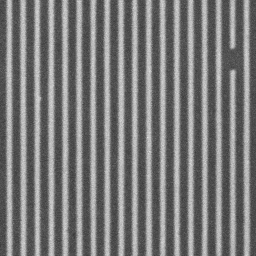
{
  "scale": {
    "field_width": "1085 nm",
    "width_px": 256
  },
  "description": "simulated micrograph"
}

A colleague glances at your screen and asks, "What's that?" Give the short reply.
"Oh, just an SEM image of parallel lines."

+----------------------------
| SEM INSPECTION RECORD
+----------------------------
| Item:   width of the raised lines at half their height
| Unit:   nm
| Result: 21.7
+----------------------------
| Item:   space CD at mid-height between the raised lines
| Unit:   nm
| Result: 39.2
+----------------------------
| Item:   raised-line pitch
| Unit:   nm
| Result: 59.1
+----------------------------